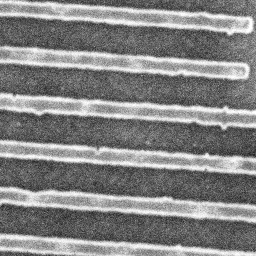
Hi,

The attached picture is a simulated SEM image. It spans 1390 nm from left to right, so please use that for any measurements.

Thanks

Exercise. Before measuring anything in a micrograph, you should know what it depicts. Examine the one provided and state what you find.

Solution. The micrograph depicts parallel lines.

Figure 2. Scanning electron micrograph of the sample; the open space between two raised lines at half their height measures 183 nm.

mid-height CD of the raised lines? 0.0751 µm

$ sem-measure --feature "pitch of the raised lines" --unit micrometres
0.255